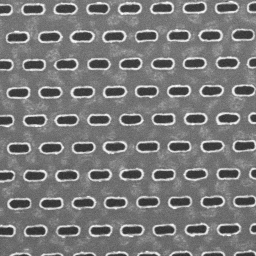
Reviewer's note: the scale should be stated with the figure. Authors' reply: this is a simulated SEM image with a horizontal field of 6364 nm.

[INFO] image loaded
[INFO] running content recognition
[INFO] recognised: a regular array of raised bodies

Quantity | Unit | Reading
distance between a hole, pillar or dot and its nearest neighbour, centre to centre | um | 0.787